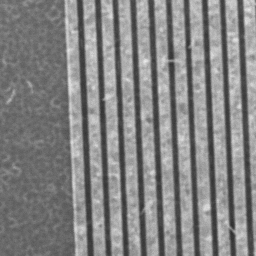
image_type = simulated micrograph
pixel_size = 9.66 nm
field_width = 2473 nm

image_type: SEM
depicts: parallel lines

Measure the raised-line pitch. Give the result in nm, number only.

172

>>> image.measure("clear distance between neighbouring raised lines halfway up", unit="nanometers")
72.3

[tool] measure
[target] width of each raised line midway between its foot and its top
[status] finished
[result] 105 nanometres